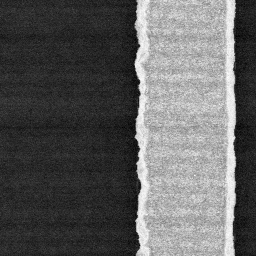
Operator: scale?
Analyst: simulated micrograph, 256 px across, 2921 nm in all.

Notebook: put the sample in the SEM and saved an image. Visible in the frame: one or a few lines or trenches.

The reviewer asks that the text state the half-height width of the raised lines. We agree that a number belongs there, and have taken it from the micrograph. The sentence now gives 1 microns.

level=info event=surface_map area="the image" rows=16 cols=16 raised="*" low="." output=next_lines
.........*****..
.........*****..
.........*****..
.........*****..
.........*****..
.........*****..
.........*****..
.........*****..
.........*****..
.........*****..
.........*****..
.........*****..
.........*****..
.........*****..
.........*****..
.........*****..